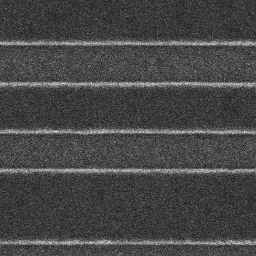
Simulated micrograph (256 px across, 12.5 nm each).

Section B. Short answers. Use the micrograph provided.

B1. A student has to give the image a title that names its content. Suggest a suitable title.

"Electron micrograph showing one or a few lines or trenches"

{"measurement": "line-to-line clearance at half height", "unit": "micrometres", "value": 0.481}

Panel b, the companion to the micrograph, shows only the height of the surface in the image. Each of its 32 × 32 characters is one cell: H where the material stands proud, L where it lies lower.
HHHHHHHHHHHHHHHHHHHHHHHHHHHHHHHH
HHHHHHHHHHHHHHHHHHHHHHHHHHHHHHHH
HHHHHHHHHHHHHHHHHHHHHHHHHHHHHHHH
HHHHHHHHHHHHHHHHHHHHHHHHHHHHHHHH
HHHHHHHHHHHHHHHHHHHHHHHHHHHHHHHH
LLLLLLLLLLLLLLLLLLLLLLLLLLLLLLLL
LLLLLLLLLLLLLLLLLLLLLLLLLLLLLLLL
LLLLLLLLLLLLLLLLLLLLLLLLLLLLLLLL
LLLLLLLLLLLLLLLLLLLLLLLLLLLLLLLL
LLLLLLLLLLLLLLLLLLLLLLLLLLLLLLLL
LHHHHHHLHLLLHHHHHHHHHHHHHHHHHHHH
HHHHHHHHHHHHHHHHHHHHHHHHHHHHHHHH
HHHHHHHHHHHHHHHHHHHHHHHHHHHHHHHH
HHHHHHHHHHHHHHHHHHHHHHHHHHHHHHHH
HHHHHHHHHHHHHHHHHHHHHHHHHHHHHHHH
HHHHHHHHHHHHHHHHHHHHHHHHHHHHHHHH
HLLHHHHHHHHHLLLLLLLLLLLLLLLLLLLH
LLLLLLLLLLLLLLLLLLLLLLLLLLLLLLLL
LLLLLLLLLLLLLLLLLLLLLLLLLLLLLLLL
LLLLLLLLLLLLLLLLLLLLLLLLLLLLLLLL
LLLLLLLLLLLLLLLLLLLLLLLLLLLLLLLL
HHHHHHHHHHHHHHHHHHHHHHHHHHHHHHHH
HHHHHHHHHHHHHHHHHHHHHHHHHHHHHHHH
HHHHHHHHHHHHHHHHHHHHHHHHHHHHHHHH
HHHHHHHHHHHHHHHHHHHHHHHHHHHHHHHH
HHHHHHHHHHHHHHHHHHHHHHHHHHHHHHHH
HHHHHHHHHHHHHHHHHHHHHHHHHHHHHHHH
HHHHHHHHHHHHHHHHHHHHHHHHHHHHHHHH
HHHHHHHHHHHHHHHHHHHHHHHHHHHHHHHH
HHHHHHHHHHHHHHHHHHHHHHHHHHHHHHHH
LLLLLLLLLLLLLLLLLLLLLLLLLLLLLLLL
LLLLLLLLLLLLLLLLLLLLLLLLLLLLLLLL